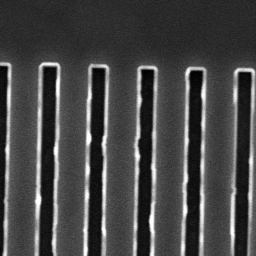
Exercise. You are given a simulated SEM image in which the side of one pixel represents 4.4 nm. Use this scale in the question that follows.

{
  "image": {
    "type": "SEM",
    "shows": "parallel lines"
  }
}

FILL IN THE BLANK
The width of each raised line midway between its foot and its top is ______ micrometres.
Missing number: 0.153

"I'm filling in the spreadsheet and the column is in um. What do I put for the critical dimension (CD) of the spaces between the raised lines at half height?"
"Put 0.0616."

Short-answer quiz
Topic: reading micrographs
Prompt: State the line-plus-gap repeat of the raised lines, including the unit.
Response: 0.215 microns